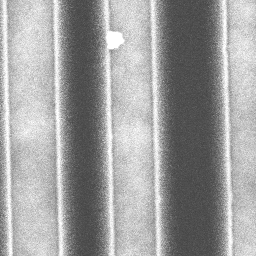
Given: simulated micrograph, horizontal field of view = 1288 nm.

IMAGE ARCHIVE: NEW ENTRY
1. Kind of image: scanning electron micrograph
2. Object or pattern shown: one or a few lines or trenches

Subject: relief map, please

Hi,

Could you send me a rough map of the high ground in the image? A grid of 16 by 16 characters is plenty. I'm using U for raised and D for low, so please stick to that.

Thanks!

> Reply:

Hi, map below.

DDDUUUUDDUUUUUDD
DDDUUUUDDDUUUUDD
DDDUUUUDDDUUUUDD
DDDUUUUDDDUUUUDD
DDDUUUUDDDUUUUDD
DDDDUUUDDDUUUUDD
DDDDUUUDDDUUUUDD
UDDDUUUDDDUUUUDD
DDDDUUUDDDUUUUDD
UDDDUUUDDDUUUUDD
UDDDUUUDDDUUUUDD
UDDDUUUDDDUUUUDD
UDDDUUUDDDUUUUDD
UDDDUUUDDDUUUUDD
UDDDUUUDDDUUUUDD
UDDDUUUDDDUUUUDD